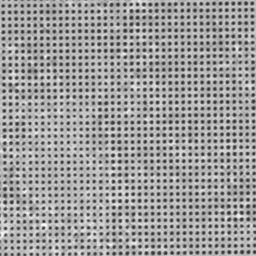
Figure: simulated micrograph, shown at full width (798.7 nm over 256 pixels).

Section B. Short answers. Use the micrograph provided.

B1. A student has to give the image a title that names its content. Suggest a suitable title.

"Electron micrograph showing a regular array of holes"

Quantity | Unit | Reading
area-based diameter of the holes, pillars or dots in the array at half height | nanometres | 11.7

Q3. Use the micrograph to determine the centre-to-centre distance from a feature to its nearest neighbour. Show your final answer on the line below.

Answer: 19.2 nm